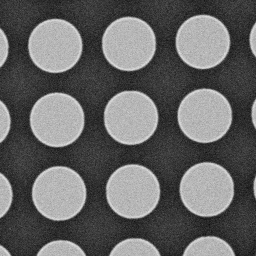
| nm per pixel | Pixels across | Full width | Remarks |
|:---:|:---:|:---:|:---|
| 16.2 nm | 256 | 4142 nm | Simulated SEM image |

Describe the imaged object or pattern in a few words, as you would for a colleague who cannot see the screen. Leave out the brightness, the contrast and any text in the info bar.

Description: an array of small figures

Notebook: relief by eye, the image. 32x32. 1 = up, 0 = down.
00000000000000000000000000000000
00000000000000000000000000000000
00000010000000011000000011100000
00000111100001111110000111110000
10001111110001111110001111111001
10001111110001111110001111111001
10001111110001111110001111110000
10001111110000111110000111110000
00000111100000011000000001000000
00000000000000000000000000000000
00000000000000000000000000000000
00000000000000001000000011100000
00000111100000111110000111110000
10001111110001111110001111111000
10001111110001111111001111111001
10001111110001111111001111111000
10001111110000111110000111110000
00000111100000011100000011100000
00000000000000000000000000000000
00000000000000000000000000000000
00000000000000000000000001100000
00000011100000111110000111110000
10000111110000111111000111111000
10001111111001111111000111111000
10001111111001111111000111111000
10001111110000111111000111111000
10000111110000011110000011110000
00000000000000000000000000000000
00000000000000000000000000000000
00000000000000000000000000000000
00000011100000011110000011110000
10000111110000111111000111111000